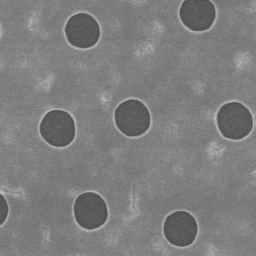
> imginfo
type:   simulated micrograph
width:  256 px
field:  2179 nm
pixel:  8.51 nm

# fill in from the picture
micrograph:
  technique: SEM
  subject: holes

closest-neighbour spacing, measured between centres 768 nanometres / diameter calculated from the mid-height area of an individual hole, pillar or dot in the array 307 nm